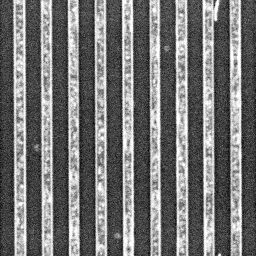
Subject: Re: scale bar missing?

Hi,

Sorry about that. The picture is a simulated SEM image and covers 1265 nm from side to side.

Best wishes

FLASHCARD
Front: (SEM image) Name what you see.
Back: parallel lines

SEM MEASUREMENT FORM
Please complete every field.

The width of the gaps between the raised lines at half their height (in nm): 85.8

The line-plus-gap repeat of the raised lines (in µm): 0.133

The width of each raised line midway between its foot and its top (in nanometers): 45.1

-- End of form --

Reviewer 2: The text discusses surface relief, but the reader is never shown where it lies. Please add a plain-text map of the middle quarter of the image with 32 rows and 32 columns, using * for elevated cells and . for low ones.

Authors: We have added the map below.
.***....**.....**.....**....***.
.***....**.....**.....**....***.
.***....**.....**.....**....***.
.***....**.....**.....**....***.
.***....**.....**.....**....***.
.***....**.....**.....**....***.
.***....**.....**.....**....***.
.***....**.....**.....**....***.
.***....**.....**.....**....***.
.***....**.....**.....**....***.
.***....**.....**.....**....***.
.**.....**.....**.....**....***.
.**.....**.....**.....**....***.
.***....**.....**.....**.....**.
.***....**.....**...........***.
.***....**.....**.....**....***.
.***....**.....**.....**....***.
.***....**.....**.....**....***.
.***....**.....**.....**....***.
.***....**......*.....**....***.
.***....**.....**.....**....***.
.***....**.....**.....**....***.
.***....**.....**.....**....***.
.***....**.....**.....**....***.
.***....**.....**.....**....***.
.***....**.....**.....**....***.
.***....**.....**.....**....***.
.*.*....**.....**.....**....***.
.*......**.....**.....**....***.
.***....**.....**.....**....***.
.***....**.....**.....**....***.
.***....**.....**.....**....***.